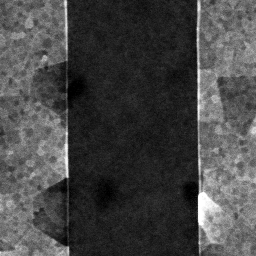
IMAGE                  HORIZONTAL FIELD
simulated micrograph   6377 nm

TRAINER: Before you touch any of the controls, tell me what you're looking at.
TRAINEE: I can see wiring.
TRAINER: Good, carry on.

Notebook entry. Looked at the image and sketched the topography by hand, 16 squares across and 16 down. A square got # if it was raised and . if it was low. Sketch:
####........####
####........####
####........####
####........####
####........####
####........####
####........####
####........####
####........####
####........####
####........####
####........####
####........####
####........####
####........####
####........####